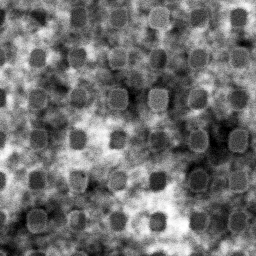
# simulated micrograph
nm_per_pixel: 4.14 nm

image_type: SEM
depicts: a regular array of raised bodies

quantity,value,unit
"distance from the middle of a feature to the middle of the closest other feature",0.165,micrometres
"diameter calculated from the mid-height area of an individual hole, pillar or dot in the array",88.8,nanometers